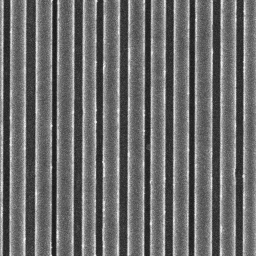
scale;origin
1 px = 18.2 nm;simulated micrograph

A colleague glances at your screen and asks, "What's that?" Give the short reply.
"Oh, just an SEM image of parallel lines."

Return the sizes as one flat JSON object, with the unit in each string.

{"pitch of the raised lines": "425 nanometres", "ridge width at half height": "0.287 microns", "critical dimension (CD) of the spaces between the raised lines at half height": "143 nanometers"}